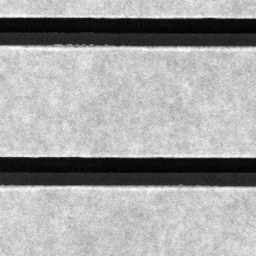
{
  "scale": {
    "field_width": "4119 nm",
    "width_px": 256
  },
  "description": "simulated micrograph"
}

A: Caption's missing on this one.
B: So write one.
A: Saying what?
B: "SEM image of lines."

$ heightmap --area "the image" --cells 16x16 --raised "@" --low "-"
@@@@@@@@@@@@@@@@
----------------
----------------
@@@@@@@@@@@@@@@@
@@@@@@@@@@@@@@@@
@@@@@@@@@@@@@@@@
@@@@@@@@@@@@@@@@
@@@@@@@@@@@@@@@@
@@@@@@@@@@@@@@@@
@@@@@@@@@@@@@@@@
----------------
----------------
@@@@@@@@@@@@@@@@
@@@@@@@@@@@@@@@@
@@@@@@@@@@@@@@@@
@@@@@@@@@@@@@@@@